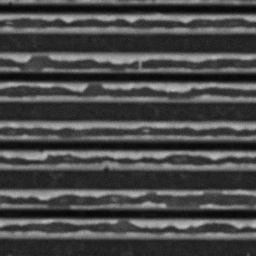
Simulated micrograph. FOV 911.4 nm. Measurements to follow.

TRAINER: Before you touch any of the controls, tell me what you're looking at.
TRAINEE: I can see parallel lines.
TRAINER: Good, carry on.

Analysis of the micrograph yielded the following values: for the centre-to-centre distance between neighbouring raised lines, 122 nm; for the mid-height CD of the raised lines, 68.1 nanometres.